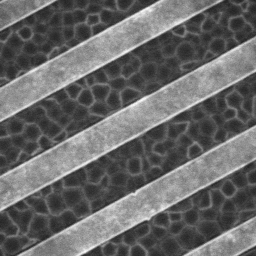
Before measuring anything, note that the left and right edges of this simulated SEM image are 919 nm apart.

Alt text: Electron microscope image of one or a few lines or trenches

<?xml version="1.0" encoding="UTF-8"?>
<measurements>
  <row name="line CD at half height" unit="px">28.7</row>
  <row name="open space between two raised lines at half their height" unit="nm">177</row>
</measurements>